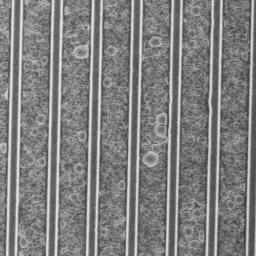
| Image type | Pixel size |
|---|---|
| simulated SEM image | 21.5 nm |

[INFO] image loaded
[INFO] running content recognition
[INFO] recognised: parallel lines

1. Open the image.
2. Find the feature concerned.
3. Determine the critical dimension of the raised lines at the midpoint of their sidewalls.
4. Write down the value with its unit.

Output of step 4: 9.12 pixels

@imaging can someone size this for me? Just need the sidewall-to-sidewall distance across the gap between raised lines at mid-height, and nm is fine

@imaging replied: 665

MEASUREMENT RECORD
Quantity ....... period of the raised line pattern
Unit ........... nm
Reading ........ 860